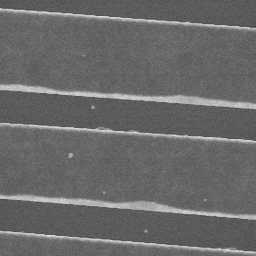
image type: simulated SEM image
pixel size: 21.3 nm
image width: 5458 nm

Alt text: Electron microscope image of lines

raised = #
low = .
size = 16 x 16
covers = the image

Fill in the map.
................
#############...
################
################
################
.###############
..............##
................
###########.....
################
################
################
..##############
..............##
#...............
#############...